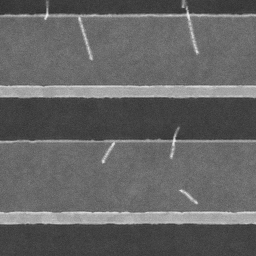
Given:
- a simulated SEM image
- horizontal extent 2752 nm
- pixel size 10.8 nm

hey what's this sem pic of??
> lines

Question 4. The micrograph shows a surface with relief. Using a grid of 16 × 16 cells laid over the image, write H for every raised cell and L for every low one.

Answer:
LLLLLLLLLLLLLLLL
HHHHHHHHHHHHHHHH
HHHHHHHHHHHHHHHH
HHHHHHHHHHHHHHHH
HHHHHHHHHHHHHHHH
HHHHHHHHHHHHHHHH
LLLLLLLLLLLLLLLL
LLLLLLLLLLLLLLLL
LLLLLLLLLLLLLLLL
HHHHHHHHHHHHHHHH
HHHHHHHHHHHHHHHH
HHHHHHHHHHHHHHHH
HHHHHHHHHHHHHHHH
HHHHHHHHHHHHHHHH
LLLLLLLLLLLLLLLL
LLLLLLLLLLLLLLLL